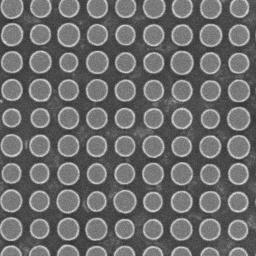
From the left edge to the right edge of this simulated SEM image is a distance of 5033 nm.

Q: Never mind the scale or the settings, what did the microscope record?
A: a regular array of raised bodies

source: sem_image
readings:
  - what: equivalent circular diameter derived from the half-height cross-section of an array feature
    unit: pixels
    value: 20.6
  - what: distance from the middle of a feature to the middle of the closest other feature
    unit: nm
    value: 543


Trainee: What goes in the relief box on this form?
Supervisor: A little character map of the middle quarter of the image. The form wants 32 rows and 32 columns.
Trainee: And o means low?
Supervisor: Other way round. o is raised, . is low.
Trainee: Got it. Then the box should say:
ooo...ooooo..ooooo..ooooo..ooooo
ooo...oooo....ooo....ooo...ooooo
.............................o..
................................
ooo....ooo....ooo....ooo....ooo.
ooo...ooooo..oooo...oooo...ooooo
oooo..ooooo..ooooo..ooooo..ooooo
ooo...ooooo..ooooo..ooooo..ooooo
ooo...oooo...oooo....ooo....ooo.
................................
................................
ooo....ooo....ooo....ooo....ooo.
ooo...oooo...oooo...oooo...ooooo
oooo..ooooo..ooooo..ooooo..ooooo
ooo...oooo...oooo...ooooo..ooooo
ooo...oooo....ooo....ooo....ooo.
................................
................................
ooo....ooo....ooo....ooo....ooo.
ooo...oooo...oooo...ooooo..ooooo
oooo..oooo...ooooo..ooooo..ooooo
oooo..oooo...oooo...ooooo..ooooo
ooo...oooo....ooo....ooo....ooo.
................................
................................
ooo....ooo....ooo...oooo....ooo.
oooo..oooo...ooooo..ooooo..ooooo
oooo..oooo...ooooo..ooooo..ooooo
oooo..oooo...oooo...ooooo..ooooo
ooo....oo.....ooo....ooo....ooo.
................................
................................